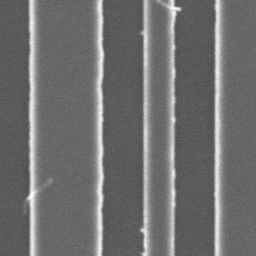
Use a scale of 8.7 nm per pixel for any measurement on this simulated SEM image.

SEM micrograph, lines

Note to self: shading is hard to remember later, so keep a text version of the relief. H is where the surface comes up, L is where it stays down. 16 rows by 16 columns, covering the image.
LLHHHHLLLHHLLLHH
LLHHHHLLLHHLLLHH
LLHHHHLLLHHLLLHH
LLHHHHLLLHHLLLHH
LLHHHHLLLHHLLLHH
LLHHHHLLLHHLLLHH
LLHHHHLLLHHLLHHH
LLHHHHLLLHHLLLHH
LLHHHHLLLHHLLLHH
LLHHHHLLLHHLLLHH
LLHHHHLLLHHLLLHH
LLHHHHLLLHHLLHHH
LLHHHHLLLHHLLHHH
LLHHHHLLLHHLLLHH
LLHHHHLLLHHLLHHH
LLHHHHLLLHHLLHHH